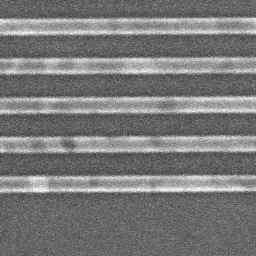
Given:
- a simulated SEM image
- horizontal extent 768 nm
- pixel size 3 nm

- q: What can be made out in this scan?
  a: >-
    parallel lines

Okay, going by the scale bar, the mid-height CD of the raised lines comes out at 41.6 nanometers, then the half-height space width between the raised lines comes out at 0.0757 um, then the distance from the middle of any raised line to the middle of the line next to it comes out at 118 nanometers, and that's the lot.